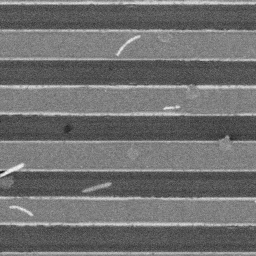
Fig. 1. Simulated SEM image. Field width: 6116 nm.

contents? lines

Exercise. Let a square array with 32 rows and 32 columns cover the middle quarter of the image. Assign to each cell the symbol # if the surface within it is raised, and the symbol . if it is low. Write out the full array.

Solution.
................................
................................
................................
................................
................................
...............................#
################################
################################
################################
################################
################################
################################
...............................#
................................
................................
................................
................................
................................
................................
################################
################################
################################
################################
################################
################################
################################
################################
................................
................................
................................
................................
................................